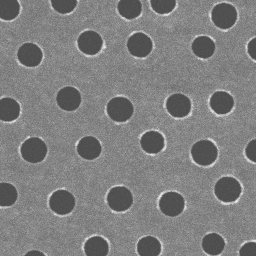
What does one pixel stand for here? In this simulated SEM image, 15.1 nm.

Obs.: a regular array of holes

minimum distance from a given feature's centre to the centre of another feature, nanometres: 747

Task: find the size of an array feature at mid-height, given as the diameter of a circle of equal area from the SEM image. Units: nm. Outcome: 384